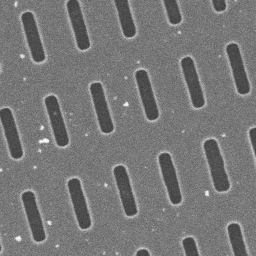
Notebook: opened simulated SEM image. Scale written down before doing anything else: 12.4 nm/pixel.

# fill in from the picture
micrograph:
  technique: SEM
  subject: a regular array of holes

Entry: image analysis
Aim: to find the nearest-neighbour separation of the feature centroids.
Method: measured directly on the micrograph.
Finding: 0.586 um